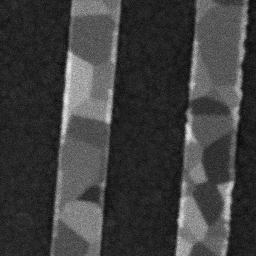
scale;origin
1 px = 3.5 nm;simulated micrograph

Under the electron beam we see one or a few lines or trenches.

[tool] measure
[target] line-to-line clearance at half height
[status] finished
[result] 268 nm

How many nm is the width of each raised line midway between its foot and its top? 170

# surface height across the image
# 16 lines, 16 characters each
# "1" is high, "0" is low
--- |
0000111000001110
0000111000001110
0000111000001110
0000111000001110
0000111000001110
0000111000001110
0000111000001110
0000111000001110
0000111000001110
0000111000001110
0000111000011110
0000111000011110
0001110000011100
0001110000011100
0001110000011100
0001110000011100